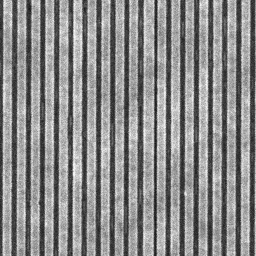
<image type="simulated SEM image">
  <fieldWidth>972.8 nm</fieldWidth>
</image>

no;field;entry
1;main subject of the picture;parallel lines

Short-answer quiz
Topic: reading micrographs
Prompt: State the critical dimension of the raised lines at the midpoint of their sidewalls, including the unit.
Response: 0.0313 µm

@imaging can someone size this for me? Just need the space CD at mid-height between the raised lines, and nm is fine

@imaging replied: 24.2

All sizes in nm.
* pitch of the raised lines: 53.2